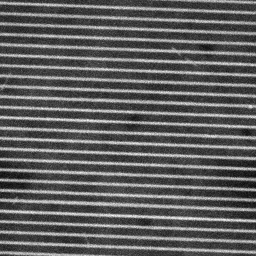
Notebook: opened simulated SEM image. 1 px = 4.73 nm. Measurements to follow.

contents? parallel lines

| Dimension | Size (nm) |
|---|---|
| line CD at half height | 10.6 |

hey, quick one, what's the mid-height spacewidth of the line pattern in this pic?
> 7.99 px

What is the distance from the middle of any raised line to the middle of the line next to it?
49.2 nm